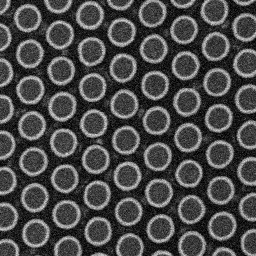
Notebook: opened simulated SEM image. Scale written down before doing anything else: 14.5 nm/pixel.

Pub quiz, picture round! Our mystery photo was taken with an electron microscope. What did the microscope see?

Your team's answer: a regular array of raised bodies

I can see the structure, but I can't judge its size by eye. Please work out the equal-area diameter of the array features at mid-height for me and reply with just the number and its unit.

25.4 px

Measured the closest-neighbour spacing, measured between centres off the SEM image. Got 517 nm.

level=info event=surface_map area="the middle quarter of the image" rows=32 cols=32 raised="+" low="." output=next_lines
++..........++++++.........+++++
++..........++++++.........+++++
++..........+++++....+++....++++
++...++++....+++....+++++....++.
+....+++++..........++++++......
....++++++..........++++++......
....++++++..........++++++....++
.....+++++...++++...+++++....+++
++...++++...++++++....+.....++++
+++.........++++++..........++++
+++.........++++++..........++++
+++.........++++++....+++...++++
++....+++....++++....+++++....+.
+....+++++..........++++++......
....++++++..........++++++......
....++++++..........++++++....++
.....+++++....+++....++++....+++
++....+++....+++++..........++++
+++..........++++++.........++++
+++..........++++++.........++++
+++..........+++++....+++....+++
++....++++...++++....+++++....++
+....++++++.........++++++......
.....++++++.........++++++......
.....++++++..........+++++....++
+....++++++...++++...++++....+++
+++...++++...+++++..........++++
+++..........++++++.........++++
+++..........++++++.........++++
+++..........+++++....++++...+++
+++...+++++...++++...+++++......
++....+++++..........++++++.....